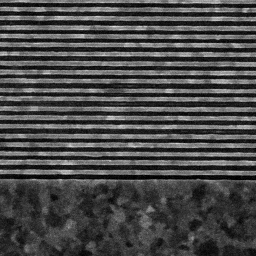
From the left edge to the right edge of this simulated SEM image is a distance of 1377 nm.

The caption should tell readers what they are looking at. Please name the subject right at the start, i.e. parallel lines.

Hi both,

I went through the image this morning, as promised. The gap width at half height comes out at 27.6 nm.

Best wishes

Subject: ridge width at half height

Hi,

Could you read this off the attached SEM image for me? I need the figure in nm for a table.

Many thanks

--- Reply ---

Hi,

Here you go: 22.9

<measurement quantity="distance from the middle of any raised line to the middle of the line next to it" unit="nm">48.7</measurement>